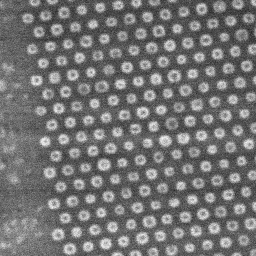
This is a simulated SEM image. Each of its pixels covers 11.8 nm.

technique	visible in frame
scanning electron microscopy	a regular array of raised bodies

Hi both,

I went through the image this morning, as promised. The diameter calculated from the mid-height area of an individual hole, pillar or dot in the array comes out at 0.0998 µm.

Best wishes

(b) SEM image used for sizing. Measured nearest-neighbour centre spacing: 0.21 microns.